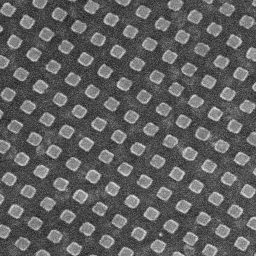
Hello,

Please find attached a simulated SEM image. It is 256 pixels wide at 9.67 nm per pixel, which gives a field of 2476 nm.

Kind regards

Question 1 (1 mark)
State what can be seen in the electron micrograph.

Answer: a regular array of raised bodies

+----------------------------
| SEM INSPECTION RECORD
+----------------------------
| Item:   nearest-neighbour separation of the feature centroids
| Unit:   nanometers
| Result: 222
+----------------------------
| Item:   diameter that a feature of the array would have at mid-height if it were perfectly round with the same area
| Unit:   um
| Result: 0.119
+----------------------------